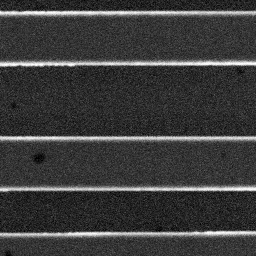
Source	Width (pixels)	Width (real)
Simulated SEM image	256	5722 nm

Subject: lines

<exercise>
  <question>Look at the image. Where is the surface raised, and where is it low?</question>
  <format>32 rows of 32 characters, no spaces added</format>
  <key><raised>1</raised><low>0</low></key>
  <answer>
00000000000000000000000000000000
00000000000000000000000000000000
11111111111111111111111111111111
11111111111111111111111111111111
11111111111111111111111111111111
11111111111111111111111111111111
11111111111111111111111111111111
11111111111111111111111111111111
00000000000000000000000000000000
00000000000000000000000000000000
00000000000000000000000000000000
00000000000000000000000000000000
00000000000000000000000000000000
00000000000000000000000000000000
00000000000000000000000000000000
00000000000000000000000000000000
00000000000000000000000000000000
11111111111111111111111111111111
11111111111111111111111111111111
11111111111111111111111111111111
11111111111111111111111111111111
11111111111111111111111111111111
11111111111111111111111111111111
11111111111111111111111111111111
00000000000000000000000000000000
00000000000000000000000000000000
00000000000000000000000000000000
00000000000000000000000000000000
00000000000000000000000000000000
11111111111111111111111111111111
11111111111111111111111111111111
11111111111111111111111111111111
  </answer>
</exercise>